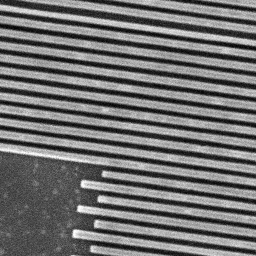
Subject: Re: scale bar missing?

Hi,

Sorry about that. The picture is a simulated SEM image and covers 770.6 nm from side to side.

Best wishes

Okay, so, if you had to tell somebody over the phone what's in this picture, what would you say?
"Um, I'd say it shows parallel lines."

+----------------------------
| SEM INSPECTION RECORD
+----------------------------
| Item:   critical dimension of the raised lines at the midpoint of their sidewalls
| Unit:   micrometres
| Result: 0.0212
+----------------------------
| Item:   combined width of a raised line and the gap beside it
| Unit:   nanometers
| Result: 37.9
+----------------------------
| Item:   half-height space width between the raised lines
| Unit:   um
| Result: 0.0186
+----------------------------